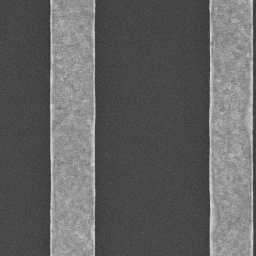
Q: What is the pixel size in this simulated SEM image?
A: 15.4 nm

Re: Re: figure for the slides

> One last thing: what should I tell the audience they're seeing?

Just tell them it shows wiring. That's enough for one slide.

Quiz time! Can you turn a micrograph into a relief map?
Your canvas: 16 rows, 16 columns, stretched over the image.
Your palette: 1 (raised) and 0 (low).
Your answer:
0001110000000111
0001110000000111
0001110000000111
0001110000000111
0001110000000111
0001110000000111
0001110000000111
0001110000000111
0001110000000111
0001110000000111
0001110000000111
0001110000000111
0001110000000111
0001110000000111
0001110000000111
0001110000000111